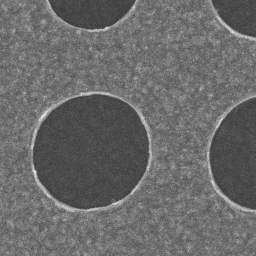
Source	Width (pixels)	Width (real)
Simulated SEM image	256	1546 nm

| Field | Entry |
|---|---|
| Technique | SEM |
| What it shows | holes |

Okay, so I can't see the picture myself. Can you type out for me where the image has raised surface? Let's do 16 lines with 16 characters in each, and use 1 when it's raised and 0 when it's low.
1110000011111000
1111000111111100
1111111111111111
1111111111111111
1111111111111111
1111111111111111
1111000011111110
1110000001111100
1100000001111000
1100000001111000
1100000001111000
1110000001111000
1110000111111100
1111111111111111
1111111111111111
1111111111111111